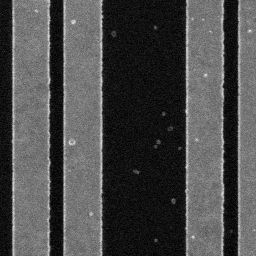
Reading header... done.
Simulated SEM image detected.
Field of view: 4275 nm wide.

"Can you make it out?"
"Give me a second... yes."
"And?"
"lines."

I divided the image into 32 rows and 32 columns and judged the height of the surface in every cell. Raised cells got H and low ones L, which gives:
LLHHHHLLHHHHHLLLLLLLLLLHHHHHLLHH
LLHHHHLLHHHHHLLLLLLLLLLHHHHHLLHH
LLHHHHLLHHHHHLLLLLLLLLLHHHHHLLHH
LLHHHHLLHHHHHLLLLLLLLLLHHHHHLLHH
LLHHHHLLHHHHHLLLLLLLLLLHHHHHLLHH
LLHHHHLLHHHHHLLLLLLLLLLHHHHHLLHH
LLHHHHLLHHHHHLLLLLLLLLLHHHHHLLHH
LLHHHHLLHHHHHLLLLLLLLLLHHHHHLLHH
LLHHHHLLHHHHHLLLLLLLLLLHHHHHLLHH
LLHHHHLLHHHHHLLLLLLLLLLHHHHHLLHH
LLHHHHLLHHHHHLLLLLLLLLLHHHHHLLHH
LLHHHHLLHHHHHLLLLLLLLLLHHHHHLLHH
LLHHHHLLHHHHHLLLLLLLLLLHHHHHLLHH
LLHHHHLLHHHHHLLLLLLLLLLHHHHHLLHH
LLHHHHLLHHHHHLLLLLLLLLLHHHHHLLHH
LLHHHHLLHHHHHLLLLLLLLLLHHHHHLLHH
LLHHHHLLHHHHHLLLLLLLLLLHHHHHLLHH
LLHHHHLLHHHHHLLLLLLLLLLHHHHHLLHH
LLHHHHLLHHHHHLLLLLLLLLLHHHHHLLHH
LLHHHHLLHHHHHLLLLLLLLLLHHHHHLLHH
LLHHHHLLHHHHHLLLLLLLLLLHHHHHLLHH
LLHHHHLLHHHHHLLLLLLLLLLHHHHHLLHH
LLHHHHLLHHHHHLLLLLLLLLLHHHHHLLHH
LLHHHHLLHHHHHLLLLLLLLLLHHHHHLLHH
LLHHHHLLHHHHHLLLLLLLLLLHHHHHLLHH
LLHHHHLLHHHHHLLLLLLLLLLHHHHHLLHH
LLHHHHLLHHHHHLLLLLLLLLLHHHHHLLHH
LLHHHHLLHHHHHLLLLLLLLLLHHHHHLLHH
LLHHHHLLHHHHHLLLLLLLLLLHHHHHLLHH
LLHHHHLLHHHHHLLLLLLLLLLHHHHHLLHH
LLHHHHLLHHHHHLLLLLLLLLLHHHHHLLHH
LLHHHHLLHHHHHLLLLLLLLLLHHHHHLLHH